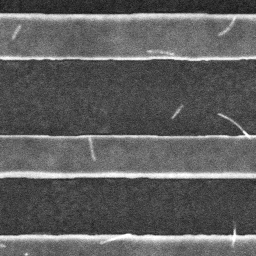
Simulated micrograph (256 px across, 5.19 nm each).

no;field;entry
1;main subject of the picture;lines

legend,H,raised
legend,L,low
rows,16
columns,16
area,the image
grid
LLLLLLLLLLLLLLLL
HHHHHHHHHHHHHHHH
HHHHHHHHHHHHHHHH
HHHHHHHHHHHHHHHH
LLLLLLLLLLLLLLLL
LLLLLLLLLLLLLLLL
LLLLLLLLLLLLLLLL
LLLLLLLLLLLLLLLL
HHHHLHHHHHLLHHHH
HHHHHHHHHHHHHHHH
HHHHHHHHHHHHHHHH
LLLLLLLLLLLLLLLL
LLLLLLLLLLLLLLLL
LLLLLLLLLLLLLLLL
LLLLLLLLLLLLLLLL
HHHHHHHHHHHHHHHH